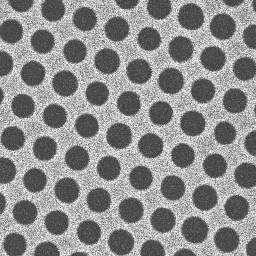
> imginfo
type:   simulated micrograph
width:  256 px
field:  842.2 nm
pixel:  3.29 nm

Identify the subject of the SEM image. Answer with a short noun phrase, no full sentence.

a regular array of holes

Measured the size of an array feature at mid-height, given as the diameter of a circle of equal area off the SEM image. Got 82.3 nm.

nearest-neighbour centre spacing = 110 nm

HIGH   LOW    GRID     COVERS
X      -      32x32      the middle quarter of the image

XXXXXXXX------XX------XXXXXXXXXX
XXXXXXXX-----XXX------XXX----XXX
--XXXXXXXX--XXXX------XX-----XXX
---XXXXXXXXXXXXX------XX------XX
---XXXX--XXXXXXXX----XXX------XX
---XXX-----XXXXXXXXXXXXX------XX
---XX------XXXXXXXXXXXXX-----XXX
--XXX------XXX----XXXXXXXX--XXXX
XXXXXX-----XX------XXXXXXXXXXXXX
XXXXXX-----XX------XXXX--XXXXXXX
XXXXXXXX-XXXX------XXX-----XXXXX
XXXXXXXXXXXXXX-----XX------XXXXX
-XXXX-XXXXXXXXX---XXX------XXX--
-XX-----XXXXXXXXXXXXX------XX---
XXX------XXXXXXXXXXXXX----XXX---
XXX------XXX----XXXXXXXXXXXXX---
XXX------XX------XXXXXXXXXXXX---
XXXX----XXX------XXX---XXXXXXX--
XXXXX-XXXXX------XX-----XXXXXXXX
XXXXXXXXXXX------XX------XXXXXXX
XX--XXXXXXXX----XX-------XXX---X
X----XXXXXXXXXXXXXX------XX-----
------XXXXXXXXXXXXX-----XXX-----
------XXXX---XXXXXXXX-XXXXX-----
------XXX-----XXXXXXXXXXXXX-----
X-----XX------XXXX--XXXXXXXX---X
XX--XXXX------XXX-----XXXXXXXXXX
XXXXXXXX------XX------XXXXXXXXXX
--XXXXXXX----XXX------XXX----XXX
---XXXXXXXXXXXXX------XX------XX
----XXXXXXXXXXXXX-----XX------XX
----XXX---XXXXXXXXX-XXXX------XX